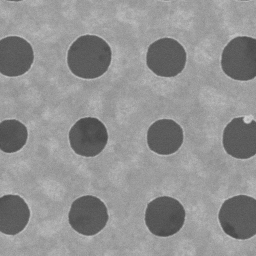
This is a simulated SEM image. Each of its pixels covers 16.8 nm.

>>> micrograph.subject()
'holes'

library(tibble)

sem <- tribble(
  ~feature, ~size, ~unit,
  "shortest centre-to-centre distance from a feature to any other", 1280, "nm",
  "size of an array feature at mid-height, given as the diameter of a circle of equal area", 686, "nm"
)